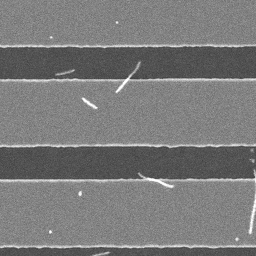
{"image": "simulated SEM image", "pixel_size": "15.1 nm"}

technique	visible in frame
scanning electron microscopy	lines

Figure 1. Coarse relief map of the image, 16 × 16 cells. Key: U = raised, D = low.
UUUUUUUUUUUUUUUU
UUUUUUUUUUUUUUUU
UUUUUUUUUUUUUUUU
DDDDDDDDDDDDDDDD
DDDDDDDDDDDDDDDD
UUUUUUUUUUUUUUUU
UUUUUUUUUUUUUUUU
UUUUUUUUUUUUUUUU
UUUUUUUUUUUUUUUU
DDDDDDDDDDDDDDDD
DDDDDDDDDDDDDDDD
UUUUUUUUUUUUUUUU
UUUUUUUUUUUUUUUU
UUUUUUUUUUUUUUUU
UUUUUUUUUUUUUUUU
DDDDDDDDDDDDDDDD